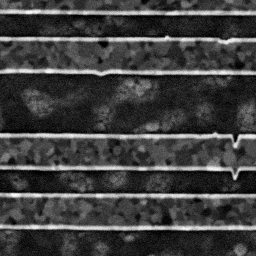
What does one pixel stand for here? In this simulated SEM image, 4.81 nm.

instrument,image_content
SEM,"one or a few lines or trenches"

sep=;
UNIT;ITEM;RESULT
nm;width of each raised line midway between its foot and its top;158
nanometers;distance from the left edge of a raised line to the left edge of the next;375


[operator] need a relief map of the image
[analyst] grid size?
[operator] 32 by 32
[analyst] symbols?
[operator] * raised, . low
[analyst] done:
********************************
...*...*************************
................................
................................
................................
********************************
********************************
********************************
********************************
................................
................................
................................
................................
................................
................................
................................
................................
*****************************.**
********************************
********************************
********************************
.............................*..
................................
................................
*****************.............**
********************************
********************************
********************************
..........*******.......*****.**
................................
................................
................................